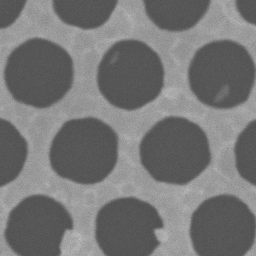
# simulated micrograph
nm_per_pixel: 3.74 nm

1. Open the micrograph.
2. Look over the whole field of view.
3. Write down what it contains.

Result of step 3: holes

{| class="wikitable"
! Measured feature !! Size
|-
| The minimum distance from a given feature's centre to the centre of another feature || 331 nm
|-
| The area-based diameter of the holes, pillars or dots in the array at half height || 258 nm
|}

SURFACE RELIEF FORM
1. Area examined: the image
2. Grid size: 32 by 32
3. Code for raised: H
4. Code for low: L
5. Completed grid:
LLLHHHHLLLLLLLLHHHLLLLLLLLHHHHLL
LLLHHHHLLLLLLLHHHHLLLLLLLLHHHHLL
LLHHHHHHLLLLLHHHHHHLLLLLLHHHHHHL
HHHHHHHHHHLLHHHHHHHHLLLLHHHHHHHH
HHHHHHHHHHHHHHHHHHHHHHHHHHHHHHHH
HHHLLLLHHHHHHHLLLLHHHHHHHHLLLLHH
HLLLLLLLHHHHHLLLLLLHHHHHHLLLLLLH
HLLLLLLLLHHHHLLLLLLLHHHHLLLLLLLL
HLLLLLLLLHHHLLLLLLLLHHHHLLLLLLLL
HLLLLLLLLHHHLLLLLLLLLHHHLLLLLLLL
HLLLLLLLLHHHLLLLLLLLHHHHLLLLLLLL
HLLLLLLLHHHHHLLLLLLLHHHHLLLLLLLH
HHLLLLLHHHHHHLLLLLLHHHHHHLLLLLLH
HHHHHLHHHHHHHHHLLHHHHHHHHHHLLHHH
HHHHHHHHHHHHHHHHHHHHHHHHHHHHHHHH
LLHHHHHHLLLLLHHHHHHLLLLLHHHHHHHL
LLHHHHHLLLLLLLHHHHLLLLLLLLHHHHLL
LLLHHHHLLLLLLLLHHHLLLLLLLLHHHHLL
LLLHHHLLLLLLLLLHHLLLLLLLLLHHHLLL
LLLHHHLLLLLLLLLHHLLLLLLLLLHHHLLL
LLLHHHLLLLLLLLLHHHLLLLLLLLHHHLLL
LLLHHHHLLLLLLLHHHHLLLLLLLHHHHHLL
LLHHHHHHHLLLLHHHHHHLLLLLHHHHHHHL
HHHHHHHHHHHHHHHHHHHHHHHHHHHHHHHH
HHHHLLHHHHHHHHHHHHHHHHHHHHHLLHHH
HHLLLLLLHHHHHLLLLLLHHHHHHLLLLLLH
HLLLLLLLLHHHLLLLLLLLHHHHLLLLLLLH
HLLLLLLLLHHHLLLLLLLLHHHHLLLLLLLL
HLLLLLLLLHHHLLLLLLLLHHHHLLLLLLLL
HLLLLLLLHHHHLLLLLLLLHHHHLLLLLLLL
HLLLLLLLHHHHLLLLLLLLHHHHLLLLLLLL
HHLLLLLLHHHHHLLLLLLHHHHHLLLLLLLH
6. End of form